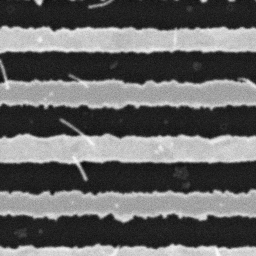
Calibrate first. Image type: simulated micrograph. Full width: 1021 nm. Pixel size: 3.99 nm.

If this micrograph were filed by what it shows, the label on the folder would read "lines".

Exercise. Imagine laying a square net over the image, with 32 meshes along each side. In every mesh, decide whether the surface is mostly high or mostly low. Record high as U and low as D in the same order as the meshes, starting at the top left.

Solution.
DDDDDDDDDDDDDDDDDDDDDDDDDDDDDDDD
DDDDDDDDDDDDDDDDDDDDDDDDDDDDDDDD
DDDDDDDDDDDDDDDDDDDDDDDDDDDDDDDD
UDDDDDDDDDDDDDDDDDDDDDDDDDDDDDDD
UUUUUUUUUUUUUUUUUUUUUUUUUUUUUUUU
UUUUUUUUUUUUUUUUUUUUUUUUUUUUUUUU
DDDDDDDDDDDDDUDDDUUDDDDDDDDDDDDD
DDDDDDDDDDDDDDDDDDDDDDDDDDDDDDDD
DDDDDDDDDDDDDDDDDDDDDDDDDDDDDDDD
DDDDDDDDDDDDDDDDDDDDDDDDDDDDDDDD
UUUUUUUUUUUUUUUUDDUUUUUUDUUUUUUU
UUUUUUUUUUUUUUUUUUUUUUUUUUUUUUUU
UUUUUUUUUUUUUUUUUUUUUUUUUUUUUUUU
DDDDDDDDDDDDDDDDDDDDDDDDDDDDDDDD
DDDDDDDDDDDDDDDDDDDDDDDDDDDDDDDD
DDDDDDDDDDDDDDDDDDDDDDDDDDDDDDDD
DDDDDDDDDDDDDDDDDDDDDDDDDDDDDDDD
UUUUUUUUUUUUUUUUUUUUUUUUUUUUUUUU
UUUUUUUUUUUUUUUUUUUUUUUUUUUUUUUU
UUUUUUUUUUUUUUUUUUUUUUUUUUUUUUUU
DDDDDDDDDDDDDDDDDDDDDDDDDDDDDDDD
DDDDDDDDDDDDDDDDDDDDDDDDDDDDDDDD
DDDDDDDDDDDDDDDDDDDDDDDDDDDDDDDD
DDDDDDDDDDDDDDDDDDDDDDDDDDDDDDDD
UUUUUUUUUUUUUUUUUUUUUUUUUUUUUUUU
UUUUUUUUUUUUUUUUUUUUUUUUUUUUUUUU
UUUUUUUUUUUUUUUUUUUUUUUUUUUUUUUU
DDDDDDDDDDDDDDDDDDDDDDDDDDDDDDDD
DDDDDDDDDDDDDDDDDDDDDDDDDDDDDDDD
DDDDDDDDDDDDDDDDDDDDDDDDDDDDDDDD
DDDDDDDDDDDDDDDDDDDDDDDDDDDDDDDD
UUUUUUUUUUUUUUUUUUUUUUUUUUUUUUUU